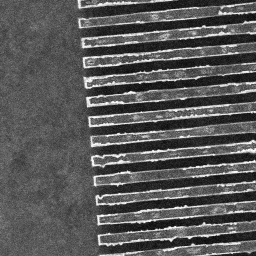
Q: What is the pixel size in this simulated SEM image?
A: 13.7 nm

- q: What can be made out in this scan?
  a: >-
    parallel lines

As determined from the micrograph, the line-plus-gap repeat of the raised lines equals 19.8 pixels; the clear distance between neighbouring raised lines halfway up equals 0.13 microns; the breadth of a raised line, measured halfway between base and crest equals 144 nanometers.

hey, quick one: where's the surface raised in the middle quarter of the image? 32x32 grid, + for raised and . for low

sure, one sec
.....+++++++....................
........................++++++++
...............+++++++++++++++++
......++++++++++++++++++++++++++
.....+++++++++++++++++..........
.....++++.......................
.......................++.++++++
...............+++++++++++++++++
......+++++++++++++++++++++++++.
......++++++++++++++............
................................
..........................++++++
...............+++++++++++++++++
......+++++++++++++++++++++++++.
......++++++++++++++............
.......++.......................
.............................+++
.............+.+++++++++++++++++
.......+++++++++++++++++++++....
.......++++++++++...............
.......++.......................
..........................++++++
...............+++++++++++++++++
.......+++++++++++++++++++++....
.......++++++++++...............
.........+......................
..........................++++++
............++++++++++++++++++++
........++++++++++++++++++++....
........++++++++++..............
................................
.......................++.++++++